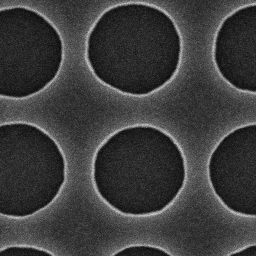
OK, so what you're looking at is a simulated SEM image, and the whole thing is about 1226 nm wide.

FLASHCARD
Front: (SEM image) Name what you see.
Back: holes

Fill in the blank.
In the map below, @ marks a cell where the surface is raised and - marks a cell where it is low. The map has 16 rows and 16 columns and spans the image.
@@@@@@@---@@@@@-
---@@@-----@@@--
----@@-----@@---
----@------@@---
----@@-----@@@--
---@@@@---@@@@@-
@@@@@@@@@@@@@@@@
@@@@@@@@@@@@@@@@
---@@@@----@@@--
----@@-----@@---
----@@------@---
----@@-----@@---
---@@@@----@@@--
@-@@@@@@@@@@@@@@
@@@@@@@@@@@@@@@@
--@@@@@@--@@@@@-